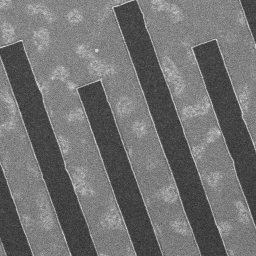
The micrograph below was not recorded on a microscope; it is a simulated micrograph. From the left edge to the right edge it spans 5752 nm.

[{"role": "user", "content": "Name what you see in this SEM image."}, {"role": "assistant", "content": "parallel lines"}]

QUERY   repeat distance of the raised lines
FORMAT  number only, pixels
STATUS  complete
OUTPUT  61.2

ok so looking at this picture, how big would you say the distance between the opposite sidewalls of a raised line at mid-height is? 0.582 µm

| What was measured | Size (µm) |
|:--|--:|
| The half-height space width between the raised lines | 0.794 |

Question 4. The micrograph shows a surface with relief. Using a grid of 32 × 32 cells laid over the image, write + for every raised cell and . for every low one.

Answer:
...............++.............++
..............++++............++
...............+++.............+
...............+++.............+
...............++++.............
.++.............+++......++.....
+++.............+++.....++++....
++++............++++.....+++....
.+++.............+++.....+++....
.+++.............++++....++++...
.++++......++....++++.....+++...
..+++.....+++.....+++.....+++...
..+++.....+++.....++++....++++..
..++++....++++.....+++.....+++..
...+++.....+++.....+++.....+++..
...+++.....++++....++++....++++.
...++++....++++.....+++...+++++.
....+++.....+++.....+++.....++++
....++++....++++....++++....++++
....++++.....+++.....+++.....+++
.....+++.....+++.....+++.....+++
.....+++.....++++....++++....+++
+....++++.....+++.....+++.....++
+.....+++.....+++.....+++.....++
++....++++....++++....++++.....+
++.....+++.....+++.....+++.....+
++.....+++.....+++.....++++....+
+++....++++....++++....++++.....
+++.....+++.....+++.....+++.....
+++.....+++.....++++....++++....
++++....++++....++++.....+++....
.+++.....+++.....+++.....+++....